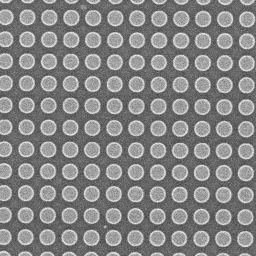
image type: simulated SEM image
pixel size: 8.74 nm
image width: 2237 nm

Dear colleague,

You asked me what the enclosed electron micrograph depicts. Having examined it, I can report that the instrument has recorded an array of small figures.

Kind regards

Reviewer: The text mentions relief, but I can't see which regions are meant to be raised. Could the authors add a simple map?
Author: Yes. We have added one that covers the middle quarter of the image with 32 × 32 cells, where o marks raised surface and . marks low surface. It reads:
ooo...ooo..ooo...ooo..ooo..oooo.
.............................o..
................................
ooo...oo....oo...oo....oo...oo..
ooo..oooo..oooo.oooo..oooo.oooo.
ooo..oooo..oooo.oooo..ooo..oooo.
.oo...oo...ooo...oo...ooo...ooo.
................................
................................
ooo..oooo..ooo...ooo..ooo...ooo.
oooo.oooo..ooo..oooo..ooo..oooo.
ooo...ooo..ooo..oooo..ooo..oooo.
............................oo..
................................
ooo...oo...ooo...oo....oo...oo..
ooo..oooo..ooo..oooo..ooo..oooo.
ooo..oooo..ooo..oooo..ooo..oooo.
.oo...oo...ooo...oo...ooo...ooo.
................................
................................
ooo..oooo..ooo...ooo..ooo..oooo.
ooo..oooo..ooo..oooo..ooo..oooo.
ooo..oooo..ooo..oooo..ooo..oooo.
.............................o..
................................
ooo...oo...ooo...oo...oo....oo..
ooo..oooo..ooo..oooo..ooo..oooo.
ooo..oooo..ooo..oooo..ooo..oooo.
.oo...oo...ooo...oo...ooo...oo..
................................
................................
ooo..oooo..ooo..oooo..ooo..ooo..